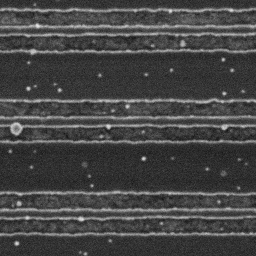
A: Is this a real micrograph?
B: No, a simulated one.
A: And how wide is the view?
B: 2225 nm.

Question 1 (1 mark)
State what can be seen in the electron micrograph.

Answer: lines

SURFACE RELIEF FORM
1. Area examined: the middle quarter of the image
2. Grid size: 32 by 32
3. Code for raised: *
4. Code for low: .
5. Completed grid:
********************************
********************************
********************************
********************************
********************************
********************************
********************************
********************************
********************************
................................
................................
................................
................................
********************************
********************************
*********.**...........**....***
................................
................................
................................
**.***.**********...*******.*.**
********************************
********************************
********************************
********************************
********************************
********************************
********************************
********************************
********************************
********************************
********************************
********************************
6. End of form